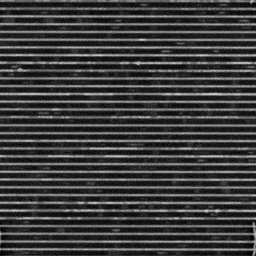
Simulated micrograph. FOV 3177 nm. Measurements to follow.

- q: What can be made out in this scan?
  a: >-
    parallel lines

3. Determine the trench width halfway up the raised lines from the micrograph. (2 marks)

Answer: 76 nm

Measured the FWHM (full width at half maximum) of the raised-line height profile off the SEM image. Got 21.7 nm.